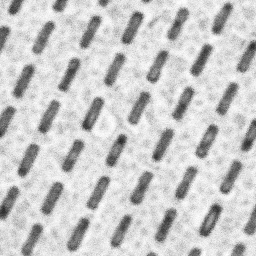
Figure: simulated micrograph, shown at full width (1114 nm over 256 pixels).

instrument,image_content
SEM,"a regular array of holes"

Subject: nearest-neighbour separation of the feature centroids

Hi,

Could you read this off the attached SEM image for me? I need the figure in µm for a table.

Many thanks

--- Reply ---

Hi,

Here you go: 0.191